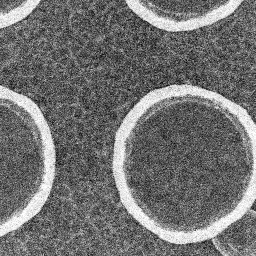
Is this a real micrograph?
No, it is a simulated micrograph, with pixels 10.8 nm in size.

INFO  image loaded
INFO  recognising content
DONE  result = raised bodies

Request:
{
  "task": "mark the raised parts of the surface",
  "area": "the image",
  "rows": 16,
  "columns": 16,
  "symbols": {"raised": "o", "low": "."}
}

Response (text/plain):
oo.......ooooo..
..........oo....
................
................
................
................
oo.......ooooo..
oo......ooooooo.
ooo.....oooooooo
ooo....ooooooooo
ooo....ooooooooo
ooo.....oooooooo
oo......oooooooo
oo.......oooooo.
..........ooo...
................